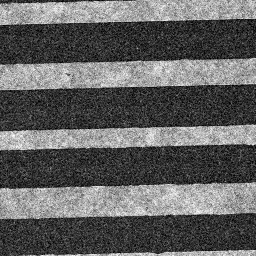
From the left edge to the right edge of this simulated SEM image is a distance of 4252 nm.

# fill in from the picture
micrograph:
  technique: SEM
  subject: one or a few lines or trenches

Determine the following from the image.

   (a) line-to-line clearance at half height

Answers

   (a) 38.9 pixels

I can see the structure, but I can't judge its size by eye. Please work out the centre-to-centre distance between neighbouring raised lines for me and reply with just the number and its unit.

1.04 µm